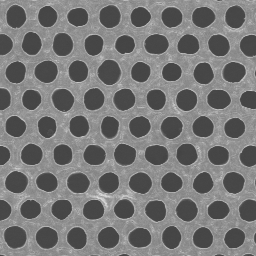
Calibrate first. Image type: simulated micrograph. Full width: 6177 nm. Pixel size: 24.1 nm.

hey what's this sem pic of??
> a regular array of holes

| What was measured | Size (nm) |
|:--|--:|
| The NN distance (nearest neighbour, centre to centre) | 741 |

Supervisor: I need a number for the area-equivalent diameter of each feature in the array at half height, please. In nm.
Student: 503